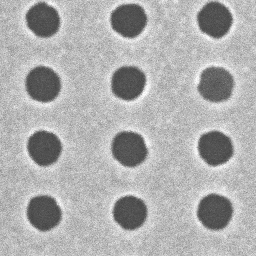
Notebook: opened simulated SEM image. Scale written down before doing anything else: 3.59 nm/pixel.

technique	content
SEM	a regular array of holes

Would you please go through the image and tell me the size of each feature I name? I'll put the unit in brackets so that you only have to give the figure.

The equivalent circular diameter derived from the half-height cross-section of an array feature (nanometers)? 129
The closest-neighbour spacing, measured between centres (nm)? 229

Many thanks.